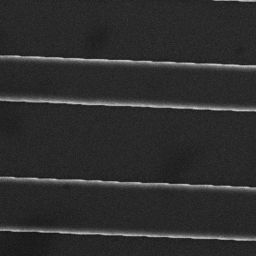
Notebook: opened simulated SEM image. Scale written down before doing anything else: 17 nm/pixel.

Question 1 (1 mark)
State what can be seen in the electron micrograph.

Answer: lines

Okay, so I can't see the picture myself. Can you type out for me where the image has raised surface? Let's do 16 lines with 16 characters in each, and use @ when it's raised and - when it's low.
----------------
----------------
----------------
----------------
@@@@@@@@@@@@@@@@
@@@@@@@@@@@@@@@@
-----@@@@@@@@@@@
----------------
----------------
----------------
----------------
@@@@@@@@@@@-----
@@@@@@@@@@@@@@@@
@@@@@@@@@@@@@@@@
---@@@@@@@@@@@@@
----------------